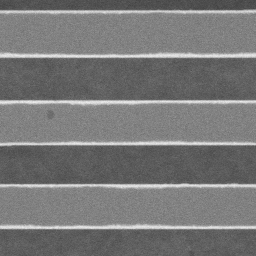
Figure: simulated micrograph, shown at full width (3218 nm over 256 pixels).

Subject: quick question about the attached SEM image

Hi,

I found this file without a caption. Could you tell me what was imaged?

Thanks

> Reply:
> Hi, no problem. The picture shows lines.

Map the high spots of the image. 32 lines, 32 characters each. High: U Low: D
DDDDDDDDDDDDDDDDDDDDDDDDDDDDDDDD
UUUUUUUUUUUUUUUUUUUUUUUUUUUUUUUU
UUUUUUUUUUUUUUUUUUUUUUUUUUUUUUUU
UUUUUUUUUUUUUUUUUUUUUUUUUUUUUUUU
UUUUUUUUUUUUUUUUUUUUUUUUUUUUUUUU
UUUUUUUUUUUUUUUUUUUUUUUUUUUUUUUU
UUUUUUUUUUUUUUUUUUUUUUUUUUUUUUUU
DDDDDDDDDDDDDDDDDDDDDDDDDDDDDDDD
DDDDDDDDDDDDDDDDDDDDDDDDDDDDDDDD
DDDDDDDDDDDDDDDDDDDDDDDDDDDDDDDD
DDDDDDDDDDDDDDDDDDDDDDDDDDDDDDDD
DDDDDDDDDDDDDDDDDDDDDDDDDDDDDDDD
DDDDDDDDDDDDDDDDDDDDDDDDDDDDDDDD
UUUUUUUUUUUUUUUUUUUUUUUUUUUUUUUU
UUUUUUUUUUUUUUUUUUUUUUUUUUUUUUUU
UUUUUUUUUUUUUUUUUUUUUUUUUUUUUUUU
UUUUUUUUUUUUUUUUUUUUUUUUUUUUUUUU
UUUUUUUUUUUUUUUUUUUUUUUUUUUUUUUU
DDDDDDDDDDDDDDDDDDDDDDDDDDDDDDDD
DDDDDDDDDDDDDDDDDDDDDDDDDDDDDDDD
DDDDDDDDDDDDDDDDDDDDDDDDDDDDDDDD
DDDDDDDDDDDDDDDDDDDDDDDDDDDDDDDD
DDDDDDDDDDDDDDDDDDDDDDDDDDDDDDDD
UUUUUUUUUUUUUUUUUUUUUUUUUUUUUUUU
UUUUUUUUUUUUUUUUUUUUUUUUUUUUUUUU
UUUUUUUUUUUUUUUUUUUUUUUUUUUUUUUU
UUUUUUUUUUUUUUUUUUUUUUUUUUUUUUUU
UUUUUUUUUUUUUUUUUUUUUUUUUUUUUUUU
UUUUUUUUUUUUUUUUUUUUUUUUUUUUUUUU
DDDDDDDDDDDDDDDDDDDDDDDDDDDDDDDD
DDDDDDDDDDDDDDDDDDDDDDDDDDDDDDDD
DDDDDDDDDDDDDDDDDDDDDDDDDDDDDDDD